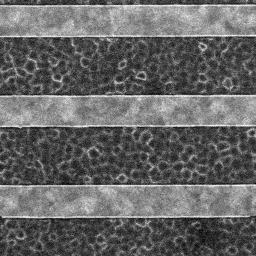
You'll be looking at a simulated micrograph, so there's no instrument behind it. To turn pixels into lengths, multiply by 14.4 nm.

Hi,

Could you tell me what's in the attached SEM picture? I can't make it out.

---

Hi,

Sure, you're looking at one or a few lines or trenches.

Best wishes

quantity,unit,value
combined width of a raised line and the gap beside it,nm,1300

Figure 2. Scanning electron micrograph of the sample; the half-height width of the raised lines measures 446 nm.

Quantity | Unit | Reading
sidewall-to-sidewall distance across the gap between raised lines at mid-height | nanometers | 858